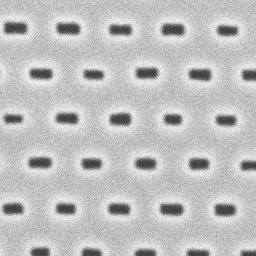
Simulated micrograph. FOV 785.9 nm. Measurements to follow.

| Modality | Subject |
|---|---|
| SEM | a regular array of holes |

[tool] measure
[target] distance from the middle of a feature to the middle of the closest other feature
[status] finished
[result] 158 nanometres